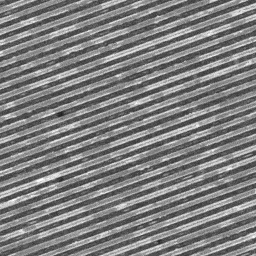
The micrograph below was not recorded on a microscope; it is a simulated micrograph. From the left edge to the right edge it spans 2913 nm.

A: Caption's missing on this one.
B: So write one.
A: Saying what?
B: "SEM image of parallel lines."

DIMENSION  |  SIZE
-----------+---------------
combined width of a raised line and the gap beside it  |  117 nanometers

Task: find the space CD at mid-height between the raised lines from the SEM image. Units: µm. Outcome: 0.065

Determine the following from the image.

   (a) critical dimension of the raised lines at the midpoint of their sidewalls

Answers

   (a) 53.6 nanometres